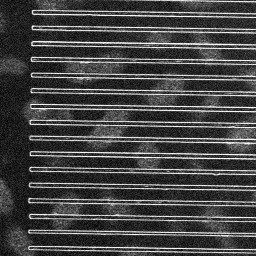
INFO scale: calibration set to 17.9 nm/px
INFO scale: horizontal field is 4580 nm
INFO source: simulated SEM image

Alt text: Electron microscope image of parallel lines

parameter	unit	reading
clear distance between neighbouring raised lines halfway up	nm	60.4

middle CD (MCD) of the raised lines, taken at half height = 12.1 pixels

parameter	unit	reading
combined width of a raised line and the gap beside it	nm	280